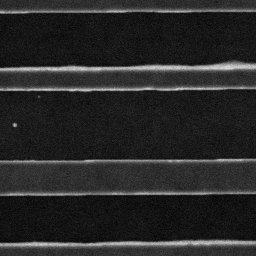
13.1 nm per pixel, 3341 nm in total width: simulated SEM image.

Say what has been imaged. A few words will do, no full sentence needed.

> lines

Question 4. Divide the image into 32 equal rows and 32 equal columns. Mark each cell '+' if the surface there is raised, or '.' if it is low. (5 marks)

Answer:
++++++++++++++++++++++++++++++++
++..............................
................................
................................
................................
................................
................................
................................
.............................++.
++++++++++++++++++++++++++++++++
++++++++++++++++++++++++++++++++
................................
................................
................................
................................
................................
................................
................................
................................
................................
++++++++++++++++++++++++++++++++
++++++++++++++++++++++++++++++++
++++++++++++++++++++++++++++++++
++++++++++++++++++++++++++++++++
................................
................................
................................
................................
................................
................................
...............+++..++++++++++++
++++++++++++++++++++++++++++++++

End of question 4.